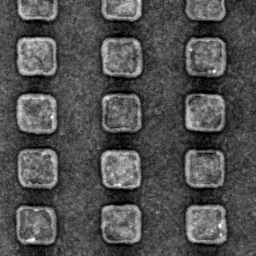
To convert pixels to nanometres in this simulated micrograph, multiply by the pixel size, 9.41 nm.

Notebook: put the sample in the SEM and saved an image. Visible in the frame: a regular array of raised bodies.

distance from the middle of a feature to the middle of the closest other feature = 521 nanometers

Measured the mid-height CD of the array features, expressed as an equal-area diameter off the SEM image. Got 376 nm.